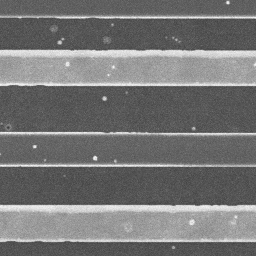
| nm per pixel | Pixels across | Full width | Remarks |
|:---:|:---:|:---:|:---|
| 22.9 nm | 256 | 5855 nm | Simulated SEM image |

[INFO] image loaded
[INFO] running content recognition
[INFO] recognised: lines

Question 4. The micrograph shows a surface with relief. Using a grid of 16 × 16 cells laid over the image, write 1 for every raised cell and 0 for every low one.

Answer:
1111111111111111
0000000000000000
0000000000000000
1111111111111111
1111111111111111
0000000000000000
0000000000000000
0000000000000000
1111111111111111
1111111111111111
0000000000000000
0000000000000000
0000000000000000
1111111111111111
1111111111111111
0000000000000000